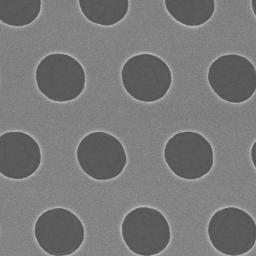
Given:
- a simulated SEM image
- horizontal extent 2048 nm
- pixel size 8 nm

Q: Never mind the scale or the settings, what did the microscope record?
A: holes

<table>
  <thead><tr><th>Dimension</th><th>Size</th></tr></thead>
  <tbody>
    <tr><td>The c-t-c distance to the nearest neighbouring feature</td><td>694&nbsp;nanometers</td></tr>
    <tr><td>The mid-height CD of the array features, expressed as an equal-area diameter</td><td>48.5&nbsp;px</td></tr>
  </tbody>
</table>